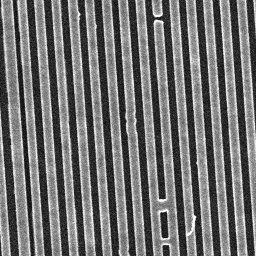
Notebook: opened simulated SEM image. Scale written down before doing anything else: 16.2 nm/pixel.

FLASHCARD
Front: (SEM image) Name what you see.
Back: parallel lines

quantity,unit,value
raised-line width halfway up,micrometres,0.153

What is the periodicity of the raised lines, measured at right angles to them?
270 nm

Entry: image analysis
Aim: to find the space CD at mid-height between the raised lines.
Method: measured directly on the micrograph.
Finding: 125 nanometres